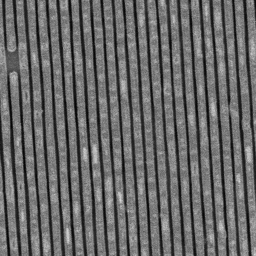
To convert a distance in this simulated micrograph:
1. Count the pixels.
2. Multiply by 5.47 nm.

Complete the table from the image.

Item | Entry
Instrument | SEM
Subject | parallel lines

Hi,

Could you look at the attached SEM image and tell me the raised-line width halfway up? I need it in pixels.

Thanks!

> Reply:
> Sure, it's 8.23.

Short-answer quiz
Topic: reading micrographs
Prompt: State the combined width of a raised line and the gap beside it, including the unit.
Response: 59.8 nm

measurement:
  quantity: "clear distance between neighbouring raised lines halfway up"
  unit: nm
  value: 15